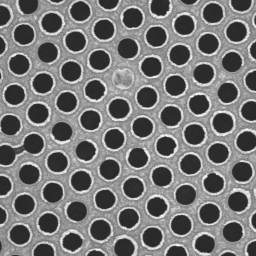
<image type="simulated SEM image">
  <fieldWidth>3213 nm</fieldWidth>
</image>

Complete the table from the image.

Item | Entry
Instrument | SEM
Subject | a regular array of holes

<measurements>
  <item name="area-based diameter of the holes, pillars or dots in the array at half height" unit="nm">254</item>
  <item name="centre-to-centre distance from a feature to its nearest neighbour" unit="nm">378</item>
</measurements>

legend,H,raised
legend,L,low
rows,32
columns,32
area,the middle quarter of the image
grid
LLLLHHHLLLLHHHHHHHHLLLLLHHHHHHHH
LLLLHHHHLHHHHHHHHHHLLLLLHHHHHHHH
LLLLHHHHHHHHHHHHHHHHLLLLHHHHHHHH
LLLLHHHHHHHHHHHHHHHHHHHHHHLLLLHH
HHHHHHLLLHHHHHHHHHHHHHHHHLLLLLHH
HHHHHLLLLLHHHHHHHHHHHHHHHLLLLLHH
HHHHHLLLLLHHHHHHHHHLLLLHHLLLLLHH
LLHHHLLLLLHHHHHHHHLLLLLHHHLLLHHH
LLLHHHLLLHHHHHHHHHLLLLLHHHHHHHHH
LLLHHHHHHHHHLLLLHHLLLLLHHHHHHHHL
LLLHHHHHHHHLLLLLHHHLLLHHHHLHHHHL
LLHHHHHHHHHLLLLLHHHHHHHHHLLLLHHH
HHHHHLLLLHHHLLLLHHHHHHHHLLLLLHHH
HHHHLLLLLHHHHLLHHHHLLHHHLLLLLHHH
HHHHLLLLLHHHHHHHHLLLLLHHHLLLLHHH
LHHHHLLLLHHHHHHHHLLLLLHHHHLHHHHL
LLHHHHLHHHHLLLHHHLLLLLHHHHHHHHLL
LLHHHHHHHHLLLLLHHHLLLLHHHHHHHHLL
LLHHHHHHHHLLLLLHHHHHHHHHLLLHHHLL
HHHHLLLHHHLLLLLHHHHHHHHLLLLLHHHL
HHHLLLLLHHHLLLHHHHHHHHHLLLLLHHHH
HHHLLLLLHHHHHHHHHLLLHHHLLLLLHHHH
HHHLLLLLHHHHHHHHLLLLLHHHLLLHHHHL
LHHHLLLHHHHHHHHHLLLLLHHHHHHHHHLL
LHHHHHHHHHLLLHHHLLLLLHHHHHHHHLLL
LHHHHHHHHLLLLLHHHLLLHHHHHHHHHLLL
HHHHHHHHHLLLLLHHHHHHHHHLLLHHHLLL
HHLLLLHHHLLLLLHHHHHHHHLLLLLHHHHL
HHLLLLLHHHLLLHHHHLHHHHLLLLLHHHHH
HHLLLLLHHHHHHHHLLLLLHHLLLLLHHHHH
HHLLLLLHHHHHHHHLLLLLHHHHLHHHHLLL
HHHLLLHHHHLHHHHLLLLLHHHHHHHHLLLL